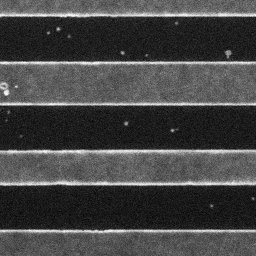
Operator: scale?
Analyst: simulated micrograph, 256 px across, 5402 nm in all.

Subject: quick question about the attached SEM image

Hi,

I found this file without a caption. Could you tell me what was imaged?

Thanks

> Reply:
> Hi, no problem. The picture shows lines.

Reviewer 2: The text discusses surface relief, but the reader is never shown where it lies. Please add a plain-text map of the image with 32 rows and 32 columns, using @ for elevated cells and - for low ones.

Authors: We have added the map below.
@@@@@@@@@@@@@@@@@@@@@@@@@@@@@@@@
@@@@@@@@@@@@@@@@@@@@@@@@@@@@@@@@
--------------------------------
--------------------------------
--------------------------------
--------------------------------
--------------------------------
--------------------------------
@@@@@@@@@@@@@@@@@@@@@@@@@@@@@@@@
@@@@@@@@@@@@@@@@@@@@@@@@@@@@@@@@
@@@@@@@@@@@@@@@@@@@@@@@@@@@@@@@@
@@@@@@@@@@@@@@@@@@@@@@@@@@@@@@@@
@@@@@@@@@@@@@@@@@@@@@@@@@@@@@@@@
--------------------------------
--------------------------------
--------------------------------
--------------------------------
--------------------------------
--------------------------------
@@@@@@@@@@@@@@@@@@@@@@@@@@@@@@@@
@@@@@@@@@@@@@@@@@@@@@@@@@@@@@@@@
@@@@@@@@@@@@@@@@@@@@@@@@@@@@@@@@
@@@@@@@@@@@@@@@@@@@@@@@@@@@@@@@@
--------------------------------
--------------------------------
--------------------------------
--------------------------------
--------------------------------
--------------------------------
@@@@@@@@@@@@@@@@@@@@@@@@@@@@@@@@
@@@@@@@@@@@@@@@@@@@@@@@@@@@@@@@@
@@@@@@@@@@@@@@@@@@@@@@@@@@@@@@@@